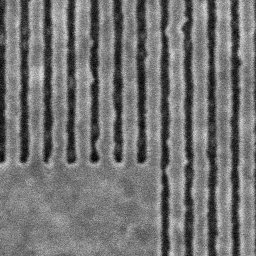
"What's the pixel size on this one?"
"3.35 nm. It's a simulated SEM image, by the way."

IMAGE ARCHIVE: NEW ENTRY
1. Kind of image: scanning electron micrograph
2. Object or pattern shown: parallel lines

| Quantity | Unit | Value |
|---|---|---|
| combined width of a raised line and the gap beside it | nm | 78.6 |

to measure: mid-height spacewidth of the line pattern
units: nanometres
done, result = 33.1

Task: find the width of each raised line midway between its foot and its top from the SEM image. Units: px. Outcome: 13.3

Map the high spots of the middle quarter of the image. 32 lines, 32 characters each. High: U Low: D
DDDUUUDDDUUUDDDUUUDDDUUUDDDUUUDD
DDDUUUDDDUUUUDDUUUDDDUUUDDUUUDDD
DDDUUUDDDUUUDDDUUUDDDUUUDDDUUUDD
UDDUUUUDDUUUDDDUUUDDDUUUDDDUUUDD
UDDUUUUDDUUUDDDUUUDDDUUUDDDUUUDD
UDDUUUDDDUUUDDDUUUDDDUUUDDDUUUDD
UDDUUUDDDUUUDDDUUUDDDUUUDDDUUUDD
DDDUUUDDDUUUDDDUUUDDDUUUDDDUUUDD
DDDUUUUDDUUUDDDUUUDDDUUUDDUUUUDD
DDDUUUUDDUUUDDDUUUDDDUUUDDUUUUDD
UDDUUUDDDUUUDDDUUUDDDUUUDDDUUUDD
UDDUUUDDDUUUUDDUUUDDDUUUDDDUUUDD
DDDUUUUDDUUUUDDUUUDDDUUUDDDUUUDD
DDDUUUUDDUUUUDDUUUDDDUUUDDDUUUDD
DDDUUUDDDUUUDDDUUUDDDUUUDDDUUUDD
DDDUUUDDDUUUDDDUUUDDDUUUDDDUUUDD
DDDUUUDDDUUUDDDUUUDDDUUUDDDUUUDD
DDDUUUDDDUUUDDDUUUDDDUUUDDDUUUDD
UDDUUUDDDUUUDDDUUUDDDUUUDDUUUUDD
UDDUUUDDUUUUDDDUUUDDDUUUDDUUUUDD
DDDUUUDDUUUUUDDUUUDDDUUUDDUUUUDD
DDDUUUDDUUUUDDDUUUDDDUUUDDDUUUDD
DDDUUUDDDUUUDDDUUUDDDUUUDDDUUUDD
DDDUUUDDDUUUDDDUUUDDDUUUDDDUUUDD
UDDUUUDDDUUUUDDUUUDDUUUUDDDUUUDD
UUUUUUUUUUUUUUUUUUUUUUUUDDUUUUDD
UUUUUUUUUUUUUUUUUUUUUUUUDDUUUUDD
UUUUUUUUUUUUUUUUUUUUUUUUDDUUUUDD
UUUUUUUUUUUUUUUUUUUUUUUUDDUUUUDD
UUUUUUUUUUUUUUUUUUUUUUUUDDDUUUDD
UUUUUUUUUUUUUUUUUUUUUUUUDDDUUUDD
UUUUUUUUUUUUUUUUUUUUUUUUDDDUUUDD